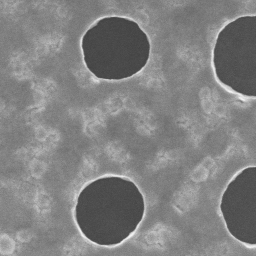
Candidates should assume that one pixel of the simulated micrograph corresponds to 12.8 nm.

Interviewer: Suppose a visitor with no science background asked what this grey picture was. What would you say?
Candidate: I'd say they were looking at holes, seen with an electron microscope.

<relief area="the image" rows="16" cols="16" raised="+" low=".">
++++++++++++++++
++++++...+++++..
+++++....+++++..
+++++....++++...
++++++...++++...
++++++++++++++..
++++++++++++++++
++++++++++++++++
++++++++++++++++
++++++++++++++++
++++++++++++++++
++++++..++++++..
+++++....+++++..
+++++....+++++..
+++++...++++++..
++++++++++++++++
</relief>